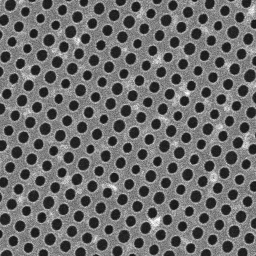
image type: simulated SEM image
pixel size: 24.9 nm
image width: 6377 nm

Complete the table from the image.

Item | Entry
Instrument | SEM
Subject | a regular array of holes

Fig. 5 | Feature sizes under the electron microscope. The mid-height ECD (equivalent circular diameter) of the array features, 0.267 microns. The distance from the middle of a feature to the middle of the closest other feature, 407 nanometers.